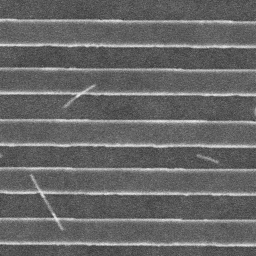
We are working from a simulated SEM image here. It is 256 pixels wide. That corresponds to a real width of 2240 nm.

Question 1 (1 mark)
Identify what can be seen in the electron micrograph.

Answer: lines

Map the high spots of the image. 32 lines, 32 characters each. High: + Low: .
................................
................................
++..............................
++++++++++++++++++++++++++++++++
++++++++++++++++++++++++++++++++
++++++++++++++++++++++++++++++++
................................
................................
................................
++++++++++++++++++++++++++++++++
++++++++++++++++++++++++++++++++
++++++++++++++++++++++++++++++++
................................
................................
................................
++++++++++++++++++++++++++++++++
++++++++++++++++++++++++++++++++
++++++++++++++++++++++++++++++++
................................
................................
................................
++++++++++++++++++++++++++++++++
++++++++++++++++++++++++++++++++
++++++++++++++++++++++++++++++++
................................
................................
................................
+++++++++++++++++++++++..+......
++++++++++++++++++++++++++++++++
++++++++++++++++++++++++++++++++
..........++++++++++++++++++++++
................................